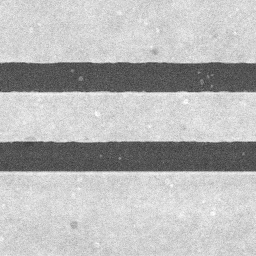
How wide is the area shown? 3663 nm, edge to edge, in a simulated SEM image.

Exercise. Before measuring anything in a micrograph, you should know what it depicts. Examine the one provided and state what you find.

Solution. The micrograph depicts lines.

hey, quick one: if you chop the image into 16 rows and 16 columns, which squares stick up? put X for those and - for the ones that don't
XXXXXXXXXXXXXXXX
XXXXXXXXXXXXXXXX
XXXXXXXXXXXXXXXX
XXXXXXXXXXXXXXXX
----------------
----------------
XXXXXXXXXXXXXXXX
XXXXXXXXXXXXXXXX
XXXXXXXXXXXXXXXX
----------------
----------------
XXXXXXXXXXXXXXXX
XXXXXXXXXXXXXXXX
XXXXXXXXXXXXXXXX
XXXXXXXXXXXXXXXX
XXXXXXXXXXXXXXXX